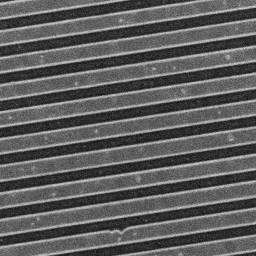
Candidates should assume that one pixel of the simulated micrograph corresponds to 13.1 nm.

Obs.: parallel lines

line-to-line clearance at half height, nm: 154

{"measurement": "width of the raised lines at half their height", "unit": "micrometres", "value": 0.193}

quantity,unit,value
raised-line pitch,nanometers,351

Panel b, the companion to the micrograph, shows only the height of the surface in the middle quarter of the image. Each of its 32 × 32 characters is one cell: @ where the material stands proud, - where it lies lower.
----------------@@@@@@@@@@@@@@@@
----------@@@@@@@@@@@@@@@@@@@@@@
---@@@@@@@@@@@@@@@@@@@@@@-------
@@@@@@@@@@@@@@@@@@@-------------
@@@@@@@@@@@@--------------------
@@@@@@@--------------------@@@@@
---------------------@@@@@@@@@@@
--------------@@@@@@@@@@@@@@@@@@
--------@@@@@@@@@@@@@@@@@@@@@@@-
-@@@@@@@@@@@@@@@@@@@@@@@--------
@@@@@@@@@@@@@@@@@@--------------
@@@@@@@@@@@@--------------------
@@@@@--------------------@@@@@@@
-------------------@@@@@@@@@@@@@
------------@@@@@@@@@@@@@@@@@@@@
------@@@@@@@@@@@@@@@@@@@@@@@---
@@@@@@@@@@@@@@@@@@@@@@@---------
@@@@@@@@@@@@@@@@----------------
@@@@@@@@@@--------------------@@
@@@---------------------@@@@@@@@
-----------------@@@@@@@@@@@@@@@
----------@@@@@@@@@@@@@@@@@@@@@@
----@@@@@@@@@@@@@@@@@@@@@@@-----
@@@@@@@@@@@@@@@@@@@@@-----------
@@@@@@@@@@@@@@------------------
@@@@@@@@----------------------@@
@----------------------@@@@@@@@@
-----------------@@@@@@@@@@@@@@@
----------@@@@@@@@@@@@@@@@@@@@@@
---@@@@@@@@@@@@@@@@@@@@@@-------
@@@@@@@@@@@@@@@@@@@@------------
@@@@@@@@@@@@@@------------------